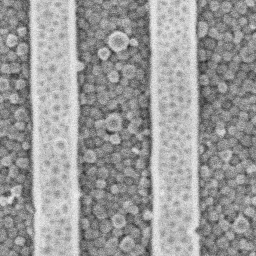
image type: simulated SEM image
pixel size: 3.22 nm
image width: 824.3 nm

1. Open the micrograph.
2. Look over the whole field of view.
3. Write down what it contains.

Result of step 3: one or a few lines or trenches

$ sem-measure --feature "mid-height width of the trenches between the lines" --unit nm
259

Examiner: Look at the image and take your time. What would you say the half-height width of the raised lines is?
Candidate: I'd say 128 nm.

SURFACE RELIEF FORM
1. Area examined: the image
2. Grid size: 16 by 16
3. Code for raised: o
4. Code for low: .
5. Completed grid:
..ooo.....oo....
..ooo.....oo....
..ooo.....oo....
..ooo.....oo....
..ooo.....oo....
..ooo.....oo....
..ooo.....oo....
..ooo.....oo....
..ooo.....oo....
..ooo.....oo....
..ooo.....oo....
..ooo.....oo....
..ooo.....oo....
..ooo.....oo....
..ooo.....oo....
..ooo.....oo....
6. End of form